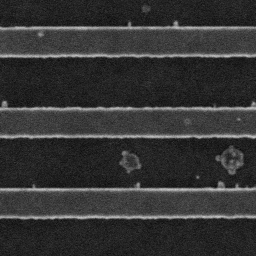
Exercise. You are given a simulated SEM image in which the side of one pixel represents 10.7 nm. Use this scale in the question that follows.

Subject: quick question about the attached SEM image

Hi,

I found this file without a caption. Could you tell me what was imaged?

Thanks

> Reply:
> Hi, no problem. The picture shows lines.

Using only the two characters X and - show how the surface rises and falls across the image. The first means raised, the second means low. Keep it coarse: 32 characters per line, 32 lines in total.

--------------------------------
--------------------------------
--------------------------------
XXXXXXXXXXXXXXXXXXXXXXXXXXXXXXXX
XXXXXXXXXXXXXXXXXXXXXXXXXXXXXXXX
XXXXXXXXXXXXXXXXXXXXXXXXXXXXXXXX
XXXXXXXXXXXXXXXXXXXXXXXXXXXXXXXX
--------------------------------
--------------------------------
--------------------------------
--------------------------------
--------------------------------
--------------------------------
---X--X-XX--X-XXX-XXXXXXXXXXXXXX
XXXXXXXXXXXXXXXXXXXXXXXXXXXXXXXX
XXXXXXXXXXXXXXXXXXXXXXXXXXXXXXXX
XXXXXXXXXXXXXXXXXXXXXXXXXXXXXXXX
--------------------------------
--------------------------------
--------------------------------
--------------------------------
--------------------------------
--------------------------------
--------------------------------
XXXXXXXXXXXXXXXXXXXXXXXXXXXXXXXX
XXXXXXXXXXXXXXXXXXXXXXXXXXXXXXXX
XXXXXXXXXXXXXXXXXXXXXXXXXXXXXXXX
--------------------------------
--------------------------------
--------------------------------
--------------------------------
--------------------------------